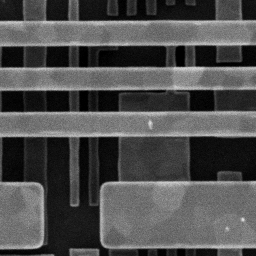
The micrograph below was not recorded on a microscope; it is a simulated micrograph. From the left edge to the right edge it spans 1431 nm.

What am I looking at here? wiring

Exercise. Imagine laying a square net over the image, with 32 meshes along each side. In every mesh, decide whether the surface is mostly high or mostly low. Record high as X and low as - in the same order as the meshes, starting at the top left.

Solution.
--------------------------------
--------------------------------
--------------------------------
XXXXXXXXXXXXXXXXXXXXXXXXXXXXXXXX
XXXXXXXXXXXXXXXXXXXXXXXXXXXXXXXX
XXXXXXXXXXXXXXXXXXXXXXXXXXXXXXXX
--------------------------------
--------------------------------
XXXX-XXXXXXXXXXXXXXXXXXXXXXXXXXX
XXXXXXXXXXXXXXXXXXXXXXXXXXXXXXXX
XXXXXXXXXXXXXXXXXXXXXXXXXXXXXXXX
--------------------------------
--------------------------------
--------------------------------
XXXXXXXXXXXXXXXXXXXXXXXXXXXXXXXX
XXXXXXXXXXXXXXXXXXXXXXXXXXXXXXXX
XXXXXXXXXXXXXXXXXXXXXXXXXXXXXXXX
--------------------------------
--------------------------------
--------------------------------
--------------------------------
--------------------------------
--------------------------------
XXXXX--------XXXXXXXXXXXXXXXXXXX
XXXXX--------XXXXXXXXXXXXXXXXXXX
XXXXX--------XXXXXXXXXXXXXXXXXXX
XXXXX--------XXXXXXXXXXXXXXXXXXX
XXXXX--------XXXXXXXXXXXXXXXXXXX
XXXXX--------XXXXXXXXXXXXXXXXXXX
XXXXX--------XXXXXXXXXXXXXXXXXXX
XXXXX--------XXXXXXXXXXXXXXXXXXX
--------------------------------